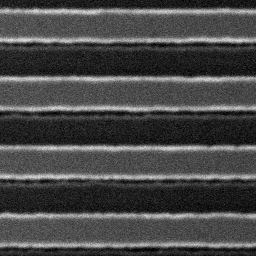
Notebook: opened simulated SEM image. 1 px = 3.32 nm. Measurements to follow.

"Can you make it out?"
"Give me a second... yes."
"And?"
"lines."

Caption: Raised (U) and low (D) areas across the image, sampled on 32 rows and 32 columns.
DDDDDDDDDDDDDDDDDDDDDDDDDDDDDDDD
UUUUUUUUUUUUUUUUUUUUUUUUUUUUUUUU
UUUUUUUUUUUUUUUUUUUUUUUUUUUUUUUU
UUUUUUUUUUUUUUUUUUUUUUUUUUUUUUUU
UUUUUUUUUUUUUUUUUUUUUUUUUUUUUUUU
DDDDDDDDDDDDDDDDDDDDDDDDDDDDDDDD
DDDDDDDDDDDDDDDDDDDDDDDDDDDDDDDD
DDDDDDDDDDDDDDDDDDDDDDDDDDDDDDDD
DDDDDDDDDDDDDDDDDDDDDDDDDDDDDDDD
DDDDDDDDDDDDDDDDDDDDDDDDDDDDDDDD
UUUUUUUUUUUUUUUUUUUUUUUUUUUUUUUU
UUUUUUUUUUUUUUUUUUUUUUUUUUUUUUUU
UUUUUUUUUUUUUUUUUUUUUUUUUUUUUUUU
UUUUUUUUUUUUUUUUUUUUUUUUUUUUUUUU
DDDDDDDDDDDDDDDDDDDDDDDDDDDDDDDD
DDDDDDDDDDDDDDDDDDDDDDDDDDDDDDDD
DDDDDDDDDDDDDDDDDDDDDDDDDDDDDDDD
DDDDDDDDDDDDDDDDDDDDDDDDDDDDDDDD
UUUUUUUUUUUUUUUUUUUUUUUUUUUUUUUU
UUUUUUUUUUUUUUUUUUUUUUUUUUUUUUUU
UUUUUUUUUUUUUUUUUUUUUUUUUUUUUUUU
UUUUUUUUUUUUUUUUUUUUUUUUUUUUUUUU
DDDDDDDDDDDDDDDDDDDDDDDDDDDDDDDD
DDDDDDDDDDDDDDDDDDDDDDDDDDDDDDDD
DDDDDDDDDDDDDDDDDDDDDDDDDDDDDDDD
DDDDDDDDDDDDDDDDDDDDDDDDDDDDDDDD
DDDDDDDDDDDDDDDDDDDDDDDDDDDDDDDD
UUUUUUUUUUUUUUUUUUUUUUUUUUUUUUUU
UUUUUUUUUUUUUUUUUUUUUUUUUUUUUUUU
UUUUUUUUUUUUUUUUUUUUUUUUUUUUUUUU
UUUUUUUUUUUUUUUUUUUUUUUUUUUUUUUU
DDDDDDDDDDDDDDDDDDDDDDDDDDDDDDDD